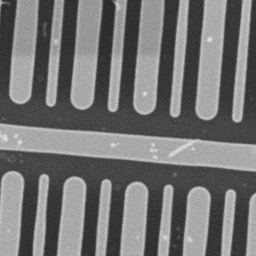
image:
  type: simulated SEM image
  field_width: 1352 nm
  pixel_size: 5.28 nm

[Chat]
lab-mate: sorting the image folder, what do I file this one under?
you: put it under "groups of lines, slits or small figures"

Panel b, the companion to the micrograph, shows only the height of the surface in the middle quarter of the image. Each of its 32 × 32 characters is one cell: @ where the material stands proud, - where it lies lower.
--@@@@@@----@@----@@@@@-----@@--
--@@@@@@----@@----@@@@@-----@@--
--@@@@@@----@@----@@@@@-----@@--
--@@@@@@----@@----@@@@@----@@@--
--@@@@@@----@@----@@@@@----@@@--
--@@@@@@---@@@----@@@@@----@@---
--@@@@@@---@@@----@@@@@----@@---
--@@@@@----@@@----@@@@@----@@---
--@@@@@----@@@----@@@@@----@@---
--@@@@@----@@@----@@@@@----@@---
---@@@@----@@-----@@@@@----@@---
-----------@@-----@@@@-----@@---
-------------------@@------@@---
--------------------------------
--------------------------------
--------------------------------
--------------------------------
@@@@@@@@@@@@--------------------
@@@@@@@@@@@@@@@@@@@@@@@@@@------
@@@@@@@@@@@@@@@@@@@@@@@@@@@@@@@@
@@@@@@@@@@@@@@@@@@@@@@@@@@@@@@@@
@@@@@@@@@@@@@@@@@@@@@@@@@@@@@@@@
--@@@@@@@@@@@@@@@@@@@@@@@@@@@@@@
-------------@@@@@@@@@@@@@@@@@@@
----------------------@@@@@@@@@@
--------------------------------
--------------------------------
--------------------------------
-@@@----------------------------
@@@@@----@@@--------------------
@@@@@----@@@----@@@@------@-----
@@@@@----@@@----@@@@@----@@-----